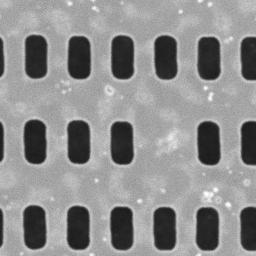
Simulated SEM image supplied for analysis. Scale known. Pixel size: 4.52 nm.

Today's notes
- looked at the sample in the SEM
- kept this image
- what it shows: a regular array of holes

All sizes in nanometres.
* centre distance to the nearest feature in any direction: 195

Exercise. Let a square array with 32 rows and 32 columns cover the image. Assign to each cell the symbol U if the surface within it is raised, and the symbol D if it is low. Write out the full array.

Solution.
UUUUUUUUUUUUUUUUUUUUUUUUUUUUUUUU
UUUUUUUUUUUUUUUUUUUUUUUUUUUUUUUU
UUUUUUUUUUUUUUUUUUUUUUUUUUUUUUUU
UUUUUUUUUUUUUUUUUUUUUUUUUUUUUUUU
UUUUDUUUUDUUUUUDUUUUDUUUUUUUUUUU
UUUDDDUUUDDUUUDDDUUDDDUUUDDUUUDD
DUUDDDUUDDDUUUDDDUUDDDUUUDDDUUDD
DUUDDDUUDDDUUUDDDUUDDDUUUDDDUUDD
DUUDDDUUDDDUUUDDDUUDDDUUUDDDUUDD
UUUUDDUUUDDUUUDDDUUUDDUUUDDUUUDD
UUUUUUUUUUUUUUUUUUUUUUUUUUUUUUUU
UUUUUUUUUUUUUUUUUUUUUUUUUUUUUUUU
UUUUUUUUUUUUUUUUUUUUUUUUUUUUUUUU
UUUUUUUUUUUUUUUUUUUUUUUUUUUUUUUU
UUUUUUUUUUUUUUUUUUUUUUUUUUUUUUUU
UUUDDDUUUDDUUUDDUUUUUUUUUDDUUUDD
UUUDDDUUDDDUUUDDDUUUUUUUUDDDUUDD
DUUDDDUUDDDUUUDDDUUUUUUUUDDDUUDD
DUUDDDUUDDDUUUDDDUUUUUUUUDDDUUDD
UUUDDDUUDDDUUUDDDUUUUUUUUDDDUUDD
UUUUDUUUUUUUUUUDUUUUUUUUUDDUUUUD
UUUUUUUUUUUUUUUUUUUUUUUUUUUUUUUU
UUUUUUUUUUUUUUUUUUUUUUUUUUUUUUUU
UUUUUUUUUUUUUUUUUUUUUUUUUUUUUUUU
UUUUUUUUUUUUUUUUUUUUUUUUUUUUUUUU
UUUUUUUUUUUUUUUUUUUUUUUUUUUUUUUU
UUUDDDUUDDDUUUDDDUUDDDUUUDDUUUDD
DUUDDDUUDDDUUUDDDUUDDDUUDDDUUUDD
DUUDDDUUDDDUUUDDDUUDDDUUDDDUUUDD
UUUDDDUUDDDUUUDDDUUDDDUUDDDUUUDD
UUUDDDUUUDDUUUDDDUUDDDUUUDDUUUDD
UUUUUUUUUUUUUUUUUUUUUUUUUUUUUUUU